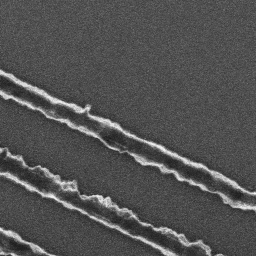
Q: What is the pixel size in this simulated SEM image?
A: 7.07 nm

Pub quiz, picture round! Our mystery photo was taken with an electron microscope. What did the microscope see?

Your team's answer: one or a few lines or trenches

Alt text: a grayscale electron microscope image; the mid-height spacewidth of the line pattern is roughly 374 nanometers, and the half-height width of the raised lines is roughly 18.4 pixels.